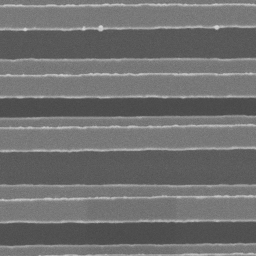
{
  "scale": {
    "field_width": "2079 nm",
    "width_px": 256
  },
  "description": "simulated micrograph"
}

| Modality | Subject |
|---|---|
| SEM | lines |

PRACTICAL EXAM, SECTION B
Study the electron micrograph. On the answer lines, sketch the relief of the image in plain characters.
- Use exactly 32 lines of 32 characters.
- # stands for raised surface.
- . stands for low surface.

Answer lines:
################################
################################
################################
#######################...##....
................................
................................
................................
..####..#.######################
################################
################################
################################
################################
................................
................................
...........................#####
################################
################################
################################
################################
................................
................................
................................
................................
################################
################################
################################
################################
################################
................................
................................
.........................#######
################################